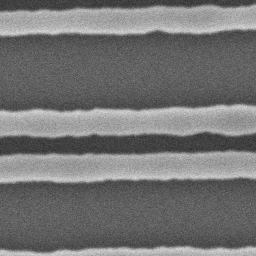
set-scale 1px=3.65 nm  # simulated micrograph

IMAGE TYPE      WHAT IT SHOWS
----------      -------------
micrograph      lines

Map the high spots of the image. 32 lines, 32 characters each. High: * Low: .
................................
..******************************
********************************
********************************
................................
................................
................................
................................
................................
................................
................................
................................
................................
..........................******
********************************
********************************
*************************.******
................................
................................
.*******************************
********************************
********************************
*************...................
................................
................................
................................
................................
................................
................................
................................
................................
*......*************************